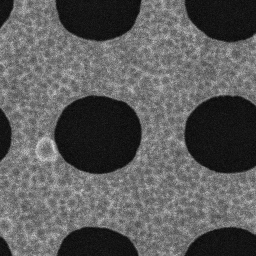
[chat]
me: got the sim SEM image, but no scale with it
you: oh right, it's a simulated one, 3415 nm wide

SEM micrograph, holes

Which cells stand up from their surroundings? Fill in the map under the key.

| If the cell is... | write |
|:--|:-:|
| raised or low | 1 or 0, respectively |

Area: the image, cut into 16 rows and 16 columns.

0111000001110000
1111000011110000
1111100111111101
1111111111111111
1111111111111111
1111111111111111
1111000011111000
0111000001110000
0110000001110000
0111000001110000
1111100011111000
1111111111111111
1111111111111111
1111111111111111
1111100111111000
0111000011110000